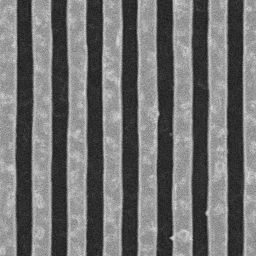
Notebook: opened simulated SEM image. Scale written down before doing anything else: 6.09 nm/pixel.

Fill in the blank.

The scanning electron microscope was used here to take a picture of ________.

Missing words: parallel lines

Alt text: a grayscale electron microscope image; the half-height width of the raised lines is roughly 113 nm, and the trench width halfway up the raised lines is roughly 100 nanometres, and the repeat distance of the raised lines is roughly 0.214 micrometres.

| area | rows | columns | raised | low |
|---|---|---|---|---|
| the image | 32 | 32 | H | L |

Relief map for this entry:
HHLLHHLLHHHLLHHLLHHHLLHHLLHHLLHH
HHLLHHLLHHHLLHHLLHHHLLHHLLHHLLHH
HHLLHHLLHHHLLHHLLHHHLLHHLLHHLLHH
HHLLHHLLHHHLLHHLLHHHLLHHLLHHLLHH
HHLLHHLLHHHLLHHLLHHLLLHHLLHHLLHH
HHLLHHLLHHHLLHHLLHHLLLHHLLHHLLHH
HHLLHHLLLHHLLHHLLHHHLLHHLLHHLLHH
HHLLHHLLLHHLLHHLLHHHLLHHLLHHLLHH
HHLLHHLLLHHLLHHLLHHHLLHHLLHHLLHH
HHLLHHLLLHHLLHHLLHHHLLHHLLHHLLHH
HHLLHHLLLHHLLHHLLHHHLLHHLLHHLLHH
HHLLHHLLLHHLLHHLLHHHLLHHLLHHLLHH
HHLLHHLLLHHLLHHLLHHHLLHHLLHHLLHH
HHLLHHLLLHHLLHHLLHHHLLHHLLHHLLHH
HHLLHHLLLHHLLHHLLHHHLLHHLLHHLLHH
HHLLHHLLLHHLLHHLLHHHLLHHLLHHLLHH
HHLLHHLLLHHLLHHLLHHHLLHHLLHHLLHH
HHLLHHLLHHHLLHHLLHHHLLHHLLHHLLHH
HHLLHHLLHHHLLHHLLHHHLLHHLLHHLLHH
HHLLHHLLLHHLLHHLLHHHLLHHLLHHLLLH
HHLLHHLLHHHLLHHLLHHHLLHHLLHHLLLH
HHLLHHLLHHHLLHHLLHHHLLHHLLHHLLLH
HHLLHHLLHHHLLHHLLHHHLLHHLLHHLLLH
HHLLHHLLLHHLLHHLLHHHLLHHLLHHLLLH
HHLLHHLLLHHLLHHLLHHHLLHHLLHHLLHH
HHLLHHLLLHHLLHHLLHHHLLHHLLHHLLHH
HHLLHHLLLHHLLHHLLHHHLLHHLLHHLLHH
HHLLHHLLLHHLLHHLLHHHLLHHLLHHLLLH
HHLLHHLLLHHLLHHLLHHHLLHHLLHHLLLH
HHLLHHLLLHHLLHHLLHHHLLHHLLHHLLLH
HHLLHHLLLHHLLHHLLHHHLLHHLLHHLLLH
HHLLHHLLHHHLLHHLLHHHLLHHLLHHLLHH